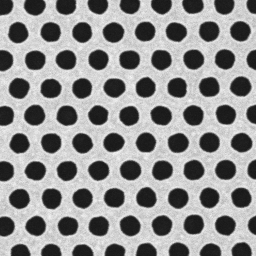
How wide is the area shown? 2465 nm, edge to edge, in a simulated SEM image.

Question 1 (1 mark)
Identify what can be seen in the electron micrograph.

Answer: a regular array of holes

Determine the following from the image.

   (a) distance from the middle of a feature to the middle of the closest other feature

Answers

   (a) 301 nm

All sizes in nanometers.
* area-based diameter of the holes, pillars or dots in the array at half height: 199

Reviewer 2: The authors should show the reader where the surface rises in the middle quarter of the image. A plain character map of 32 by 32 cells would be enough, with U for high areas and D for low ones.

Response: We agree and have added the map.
DDDUUUUDDDDUUUDDDDUUUUDDDDDUUUDD
DDUUUUUUDUUUUUUUUUUUUUUUDUUUUUUU
UUUUUUUUUUUUUUUUUUUUUUUUUUUUUUUU
UUUUDUUUUUUUDUUUUUUDDDUUUUUUDUUU
UUDDDDDUUUDDDDDUUUDDDDDUUUDDDDUU
UUDDDDDUUUDDDDDUUUDDDDDUUUDDDDDU
UUDDDDDUUUDDDDDUUUDDDDDUUUDDDDDU
UUDDDDDUUUDDDDUUUUDDDDUUUUDDDDDU
UUUUDUUUUUUUDUUUUUUUDUUUUUUUDUUU
UUUUUUUUUUUUUUUUUUUUUUUUUUUUUUUU
DDUUUUUUDUUUUUUUDUUUUUUUUUUUUUUD
DDDUUUDDDDDUUUDDDDUUUUDDDDUUUUDD
DDDUUUDDDDDUUUDDDDDUUUDDDDDUUUDD
DDDUUUDDDDDUUUDDDDDUUUDDDDDUUUDD
DDDUUUUDDDDUUUDDDDUUUUDDDDUUUUDD
DDUUUUUUUUUUUUUUUUUUUUUUUUUUUUUU
UUUUUUUUUUUUUUUUUUUUUUUUUUUUUUUU
UUUDDDUUUUUDDDUUUUUDDDUUUUUUDDUU
UUDDDDDUUUDDDDDUUUDDDDDUUUDDDDDU
UUDDDDDUUUDDDDDUUUDDDDDUUUDDDDDU
UUDDDDDUUUDDDDDUUUDDDDDUUUDDDDDU
UUUDDDDUUUUDDDUUUUUDDDUUUUUDDDUU
UUUUDUUUUUUUUUUUUUUUUUUUUUUUUUUU
UUUUUUUUUUUUUUUUUUUUUUUUUUUUUUUU
DDUUUUUDDDUUUUUDDDUUUUUDDDUUUUUD
DDDUUUDDDDDUUUDDDDDUUUDDDDDUUUDD
DDDUUUDDDDDUUUDDDDDUUUDDDDDUUUDD
DDDUUUDDDDDUUUDDDDDUUUDDDDDUUUDD
DDUUUUUDDDDUUUUDDDUUUUUDDDUUUUUD
UUUUUUUUUUUUUUUUUUUUUUUUUUUUUUUU
UUUUUUUUUUUUUUUUUUUUUUUUUUUUUUUU
UUUDDDUUUUUDDDUUUUUDDDUUUUUDDDUU